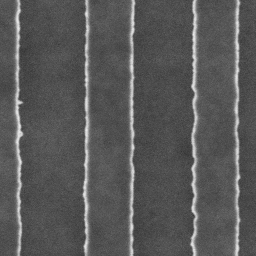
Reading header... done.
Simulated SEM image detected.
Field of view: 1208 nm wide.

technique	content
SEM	lines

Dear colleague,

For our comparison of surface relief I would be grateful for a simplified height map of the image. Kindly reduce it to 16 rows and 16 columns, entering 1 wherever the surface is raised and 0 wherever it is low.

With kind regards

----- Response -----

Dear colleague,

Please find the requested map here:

1000011100001110
1000011100001110
1000011100001110
1000011100001110
1000011100001110
1000011100001110
1000011100001110
1000011100001110
1000011100001110
1000011100001110
1000011100001110
1000011100001110
1000011100001110
1000011100001110
1000011100001110
1000011100001110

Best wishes